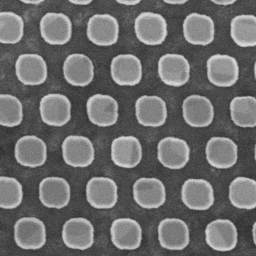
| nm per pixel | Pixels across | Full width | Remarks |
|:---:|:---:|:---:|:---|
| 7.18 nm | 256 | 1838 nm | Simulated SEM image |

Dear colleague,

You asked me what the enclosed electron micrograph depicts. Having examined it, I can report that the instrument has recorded a regular array of raised bodies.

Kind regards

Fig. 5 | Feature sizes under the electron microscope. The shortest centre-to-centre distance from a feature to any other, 337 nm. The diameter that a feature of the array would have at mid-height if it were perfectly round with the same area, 219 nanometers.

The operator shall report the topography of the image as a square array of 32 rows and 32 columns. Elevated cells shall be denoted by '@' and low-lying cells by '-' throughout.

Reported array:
--------------------------------
--------------------------------
@@@--@@@---@@@---@@@---@@@---@@@
@@@--@@@@--@@@@--@@@@--@@@@--@@@
@@@--@@@@--@@@@--@@@@--@@@@--@@@
------------------------------@@
--------------------------------
--@@@---@@@---@@@---@@@---@@@---
--@@@@--@@@@--@@@@--@@@---@@@@--
--@@@@--@@@@--@@@@--@@@---@@@@--
----@----@@----@@----------@@---
--------------------------------
@@---@@@---@@@---@@@---@@@---@@@
@@@--@@@@--@@@@--@@@@--@@@---@@@
@@@--@@@@--@@@@--@@@@--@@@---@@@
@@-----@----@@----@@----@@----@@
--------------------------------
---@@---@@@---@@@---@@-----@@---
--@@@@--@@@@--@@@@--@@@---@@@---
--@@@@--@@@@--@@@@--@@@---@@@---
---@@----@@----@@---@@@----@@---
--------------------------------
@@----@@---@@@----@@---------@@@
@@@--@@@@--@@@---@@@---@@@---@@@
@@@--@@@@--@@@@--@@@@--@@@@--@@@
@@----@@----@@---@@@---@@@---@@@
--------------------------------
---@-----@-----@-----@----------
--@@@---@@@---@@@---@@@---@@@---
--@@@---@@@---@@@@--@@@---@@@---
--@@@---@@@---@@@---@@@---@@@---
--------------------------------